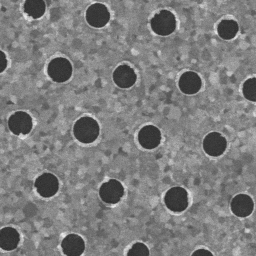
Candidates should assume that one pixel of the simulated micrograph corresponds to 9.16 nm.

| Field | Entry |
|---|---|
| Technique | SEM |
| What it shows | a regular array of holes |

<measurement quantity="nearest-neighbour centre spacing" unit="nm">594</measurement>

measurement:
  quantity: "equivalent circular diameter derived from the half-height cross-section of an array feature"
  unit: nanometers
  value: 230